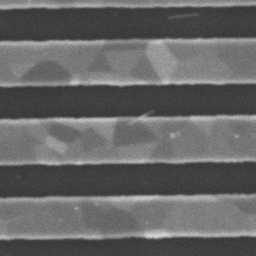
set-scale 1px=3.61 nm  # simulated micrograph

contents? lines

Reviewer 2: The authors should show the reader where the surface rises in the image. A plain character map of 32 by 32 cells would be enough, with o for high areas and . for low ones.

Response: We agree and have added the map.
oooooooooooooooooooooooooooooooo
................................
................................
................................
................................
oooooooooooooooooooooooooooooooo
oooooooooooooooooooooooooooooooo
oooooooooooooooooooooooooooooooo
oooooooooooooooooooooooooooooooo
oooooooooooooooooooooooooooooooo
ooooooooooooooooooooooo.o..o....
................................
................................
................................
...........................o.ooo
oooooooooooooooooooooooooooooooo
oooooooooooooooooooooooooooooooo
oooooooooooooooooooooooooooooooo
oooooooooooooooooooooooooooooooo
oooooooooooooooooooooooooooooooo
ooo...oo.o......................
................................
................................
................................
........................oooooooo
oooooooooooooooooooooooooooooooo
oooooooooooooooooooooooooooooooo
oooooooooooooooooooooooooooooooo
oooooooooooooooooooooooooooooooo
oooooooooooooooooooooooooooooo.o
................................
................................